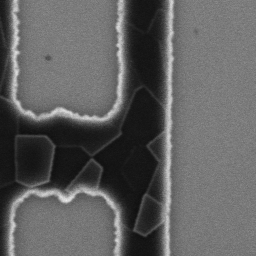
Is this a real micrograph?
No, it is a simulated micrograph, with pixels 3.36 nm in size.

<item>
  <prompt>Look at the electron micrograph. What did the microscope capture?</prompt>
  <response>one or a few lines or trenches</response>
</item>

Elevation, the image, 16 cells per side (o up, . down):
o.......ooo.....
o......oooo.....
o......oooo.....
o......oooo.....
o.......ooo.....
o......oooo.....
o......oooo.....
ooooooooooo.....
ooooooooooo.....
ooooooooooo.....
ooooooooooo.....
ooooooooooo.....
o......oooo.....
o......oooo.....
o......ooo......
o......oooo.....